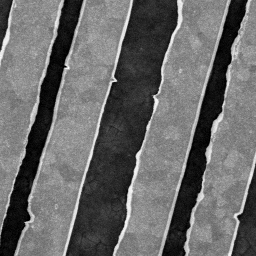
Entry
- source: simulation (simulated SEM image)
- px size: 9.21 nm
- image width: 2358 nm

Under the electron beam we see one or a few lines or trenches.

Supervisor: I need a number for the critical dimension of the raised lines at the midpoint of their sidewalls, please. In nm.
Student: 422